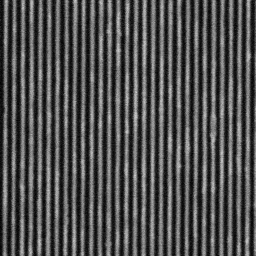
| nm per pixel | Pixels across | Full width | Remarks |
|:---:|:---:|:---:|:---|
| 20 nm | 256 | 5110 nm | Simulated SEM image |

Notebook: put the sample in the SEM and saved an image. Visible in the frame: parallel lines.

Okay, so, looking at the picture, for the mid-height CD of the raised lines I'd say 57.4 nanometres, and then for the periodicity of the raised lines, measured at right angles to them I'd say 173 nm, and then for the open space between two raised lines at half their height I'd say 112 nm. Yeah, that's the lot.